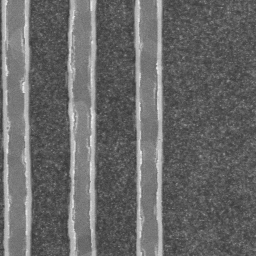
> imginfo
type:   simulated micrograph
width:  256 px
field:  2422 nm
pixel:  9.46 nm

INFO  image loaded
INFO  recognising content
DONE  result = one or a few lines or trenches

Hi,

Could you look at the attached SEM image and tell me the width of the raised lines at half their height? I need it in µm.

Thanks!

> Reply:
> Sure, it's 0.205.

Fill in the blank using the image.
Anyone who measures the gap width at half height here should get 424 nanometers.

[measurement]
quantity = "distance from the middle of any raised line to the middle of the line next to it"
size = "627 nanometres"